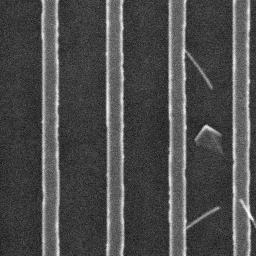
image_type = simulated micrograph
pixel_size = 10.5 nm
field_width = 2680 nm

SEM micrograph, lines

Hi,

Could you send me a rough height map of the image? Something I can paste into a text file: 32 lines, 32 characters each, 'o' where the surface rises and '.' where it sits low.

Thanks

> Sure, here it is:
.....oo......oo......oo......oo.
.....oo......oo......oo......oo.
.....oo......oo......oo......oo.
.....oo......oo......oo......oo.
.....oo......oo......oo......oo.
.....oo......oo......oo......oo.
.....oo......oo......oo......oo.
.....oo......oo......oo......oo.
.....oo......oo......oo......oo.
.....oo......oo......oo......oo.
.....oo......oo......oo......oo.
.....oo......oo......oo......oo.
.....oo......oo......oo......oo.
.....oo......oo......oo......oo.
.....oo......oo......oo......oo.
.....oo......oo......oo......oo.
.....oo......oo......oo......oo.
.....oo......oo......oo......oo.
.....oo......oo......oo......oo.
.....oo......oo......oo......oo.
.....oo......oo......oo......oo.
.....oo......oo......oo......oo.
.....oo......oo......oo......oo.
.....oo......oo......oo......oo.
.....oo......oo......oo......oo.
.....oo......oo......oo......oo.
.....oo......oo......oo......oo.
.....oo......oo......oo......oo.
.....oo......oo......oo......oo.
.....oo......oo......oo......oo.
.....oo......oo......oo......oo.
.....oo......oo......oo......oo.